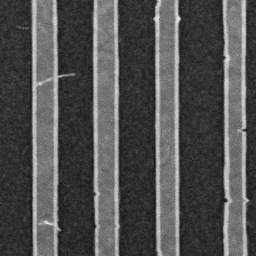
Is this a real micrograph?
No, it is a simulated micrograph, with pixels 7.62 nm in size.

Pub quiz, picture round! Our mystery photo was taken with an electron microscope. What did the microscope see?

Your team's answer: one or a few lines or trenches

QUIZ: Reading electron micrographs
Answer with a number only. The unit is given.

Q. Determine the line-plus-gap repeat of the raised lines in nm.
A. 483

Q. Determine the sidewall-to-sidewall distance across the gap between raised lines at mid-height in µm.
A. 0.311